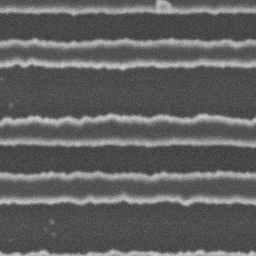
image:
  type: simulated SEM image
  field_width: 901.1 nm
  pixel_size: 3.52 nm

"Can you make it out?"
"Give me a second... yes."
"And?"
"lines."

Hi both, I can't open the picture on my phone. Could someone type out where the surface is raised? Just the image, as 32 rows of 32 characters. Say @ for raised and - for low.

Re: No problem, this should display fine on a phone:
@@@@@@@@@@@@@@@@@@@@@@@@@@@@@@@@
---@@---@@@--@@@---@@@@@--@@-@--
--------------------------------
--------------------------------
--------------------------------
@@@@@@@@@@@@@@@@@@@@@@@@@@@@@@@@
@@@@@@@@@@@@@@@@@@@@@@@@@@@@@@@@
@@@@@@@@@@@@@@@@@@@@@@@@@@@@@@@@
---------------@----------------
--------------------------------
--------------------------------
--------------------------------
--------------------------------
--------------------------------
-------------@@----------@------
@@@@@@@@@@@@@@@@@@@@@@@@@@@@@@@@
@@@@@@@@@@@@@@@@@@@@@@@@@@@@@@@@
@@@@@@@@@@@@@@@@@@@@@@@@@@@@@@@@
--------------------------------
--------------------------------
--------------------------------
---------------------------@----
@@@@@@@@@@@@@@@@@@@@@@@@@@@@@@@@
@@@@@@@@@@@@@@@@@@@@@@@@@@@@@@@@
@@@@@@@@@@@@@@@@@@@@@@@@@@@@@@@@
--------------------------------
--------------------------------
--------------------------------
--------------------------------
--------------------------------
--------------------------------
--------------@-----------------